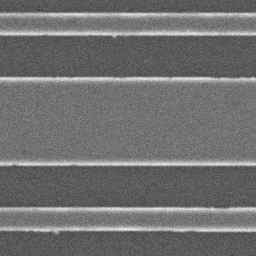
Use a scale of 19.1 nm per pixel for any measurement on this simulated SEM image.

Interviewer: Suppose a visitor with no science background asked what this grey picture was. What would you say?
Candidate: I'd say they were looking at lines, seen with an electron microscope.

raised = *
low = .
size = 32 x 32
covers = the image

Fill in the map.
................................
................................
********************************
********************************
................................
................................
................................
................................
................................
................................
********************************
********************************
********************************
********************************
********************************
********************************
********************************
********************************
********************************
********************************
*.**********.*******************
................................
................................
................................
................................
................................
********************************
********************************
********************************
................................
................................
................................